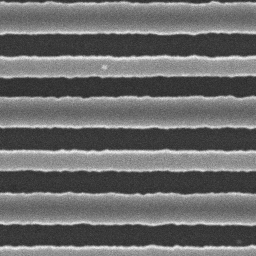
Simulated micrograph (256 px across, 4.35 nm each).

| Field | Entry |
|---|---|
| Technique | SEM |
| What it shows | lines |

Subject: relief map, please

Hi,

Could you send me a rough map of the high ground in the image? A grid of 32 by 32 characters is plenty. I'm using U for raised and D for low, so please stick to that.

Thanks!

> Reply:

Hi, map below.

UUUUUUUUUUUUUUUUUUUUUUUUUUUUUUUU
UUUUUUUUUUUUUUUUUUUUUUUUUUUUUUUU
UUUUUUUUUUUUUUUUUUUUUUUUUUUUUUUU
UUUUUUUUUUUUUUUUUUUUUUUUUUUUUUUU
DDDDDDDDDDDDDDDDDDDDDDDDDDDDDDDD
DDDDDDDDDDDDDDDDDDDDDDDDDDDDDDDD
DDDDDDDDDDDDDDDDDDDDDDDDDDDDDDDD
UUUUUUUUUUUUUUUUUUUUUUUUUUUUUUUU
UUUUUUUUUUUUUUUUUUUUUUUUUUUUUUUU
UUUUUUUUUUUDUUUUUUUDDUDDDDDDUDDD
DDDDDDDDDDDDDDDDDDDDDDDDDDDDDDDD
DDDDDDDDDDDDDDDDDDDDDDDDDDDDDDDD
UUUUUUUUUUUUUUUUUUUUUUUUUUUUUUUU
UUUUUUUUUUUUUUUUUUUUUUUUUUUUUUUU
UUUUUUUUUUUUUUUUUUUUUUUUUUUUUUUU
UUUUUUUUUUUUUUUUUUUUUUUUUUUUUUUU
DDDDDDDDDDDDDDDDDDDDDDDDDDDDDDDD
DDDDDDDDDDDDDDDDDDDDDDDDDDDDDDDD
DDDDDDDDDDDDDDDDDDDDDDDDDDDDDDDD
UUUUUUUUUUUUUUUUUUUUUUUUUUUUUUUU
UUUUUUUUUUUUUUUUUUUUUUUUUUUUUUUU
DDDDDDDDDDDDDDDDDDDDDDDDDDDDDDDD
DDDDDDDDDDDDDDDDDDDDDDDDDDDDDDDD
DDDDDDDDDDDDDDDDDDDDDDDDDDDDDDDD
UUUUUUUUUUUUUUUUUUUUUUUUUUUUUUUU
UUUUUUUUUUUUUUUUUUUUUUUUUUUUUUUU
UUUUUUUUUUUUUUUUUUUUUUUUUUUUUUUU
UUUUUUUUUUUUUUUUUUUUUUUUUUUUUUUU
DDDDDDDDDDDDDDDDDDDDDDDDDDDDDDDD
DDDDDDDDDDDDDDDDDDDDDDDDDDDDDDDD
DDDDDDDDDDDDDDDDDDDDDDDDDDDDDDDD
UUUUUUUUUUUUUUUUUUUUUUUUUUUUUUUU